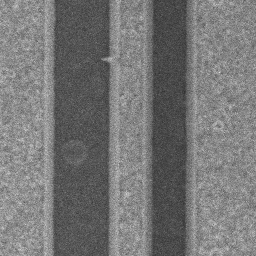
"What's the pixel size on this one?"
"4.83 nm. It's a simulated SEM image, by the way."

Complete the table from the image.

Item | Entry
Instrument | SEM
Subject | one or a few lines or trenches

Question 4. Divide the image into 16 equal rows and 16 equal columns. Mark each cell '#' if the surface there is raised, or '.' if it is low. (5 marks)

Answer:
###....##...####
###....##...####
###....##...####
###....##...####
###....##...####
###....##...####
###....##...####
###....##...####
###....##...####
###....##...####
###....##...####
###....##...####
###....##...####
###....##...####
###....##...####
###....##...####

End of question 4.